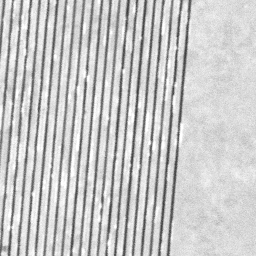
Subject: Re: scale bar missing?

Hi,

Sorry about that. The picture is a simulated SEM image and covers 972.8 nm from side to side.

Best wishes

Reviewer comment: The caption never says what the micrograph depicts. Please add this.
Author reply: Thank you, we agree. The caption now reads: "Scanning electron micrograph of parallel lines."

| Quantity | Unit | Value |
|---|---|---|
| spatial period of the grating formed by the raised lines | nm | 33.5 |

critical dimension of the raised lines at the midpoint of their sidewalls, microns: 0.0237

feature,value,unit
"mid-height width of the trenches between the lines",10.4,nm